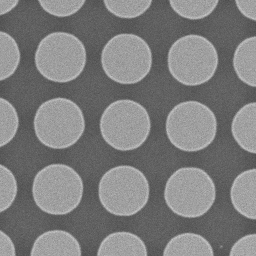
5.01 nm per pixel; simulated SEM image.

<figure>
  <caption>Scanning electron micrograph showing an array of small figures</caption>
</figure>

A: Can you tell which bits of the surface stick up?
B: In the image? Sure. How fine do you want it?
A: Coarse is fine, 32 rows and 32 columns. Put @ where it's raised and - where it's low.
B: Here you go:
@@---@@@@@---@@@@@@--@@@@@@---@@
@-----@@@-----@@@@----@@@@----@@
--------------------------------
--------------------------------
@-----@@@------@@------@@-------
@@---@@@@@---@@@@@----@@@@----@@
@@---@@@@@@--@@@@@@--@@@@@@--@@@
@@--@@@@@@@--@@@@@@--@@@@@@--@@@
@@---@@@@@---@@@@@@--@@@@@@--@@@
@-----@@@@----@@@@----@@@@----@@
-----------------------@@------@
--------------------------------
@-----@@------------------------
@@---@@@@@---@@@@@----@@@@----@@
@@--@@@@@@---@@@@@---@@@@@@--@@@
@@--@@@@@@---@@@@@@--@@@@@@--@@@
@@--@@@@@@---@@@@@@--@@@@@@--@@@
@----@@@@@---@@@@@---@@@@@@---@@
--------------@@@-----@@@-----@@
--------------------------------
--------------------------------
@----@@@@----@@@@-----@@@@-----@
@@--@@@@@@---@@@@@---@@@@@---@@@
@@--@@@@@@--@@@@@@@--@@@@@@--@@@
@@--@@@@@@--@@@@@@@--@@@@@@--@@@
@----@@@@@---@@@@@---@@@@@---@@@
------@@@-----@@@-----@@@@----@@
--------------------------------
--------------------------------
@----@@@@-----@@@-----@@@------@
@@--@@@@@@---@@@@@---@@@@@---@@@
@@--@@@@@@--@@@@@@--@@@@@@@--@@@